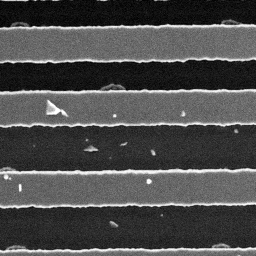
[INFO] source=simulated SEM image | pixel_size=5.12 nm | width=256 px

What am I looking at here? lines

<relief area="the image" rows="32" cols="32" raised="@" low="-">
--------------------------------
--------------------------------
--------------------------------
@@@@@@@@@@@@@@@@@@@@@@@@@@@@@@@@
@@@@@@@@@@@@@@@@@@@@@@@@@@@@@@@@
@@@@@@@@@@@@@@@@@@@@@@@@@@@@@@@@
@@@@@@@@@@@@@@@@@@@@@@@@@@@@@@@@
@@@@@@@@@@@@@@@@@@@@@@@-----@@@-
--------------------------------
--------------------------------
--------------------------------
@@@@@@@@@@@@@@@@@@@@@@@@@@@@@@@@
@@@@@@@@@@@@@@@@@@@@@@@@@@@@@@@@
@@@@@@@@@@@@@@@@@@@@@@@@@@@@@@@@
@@@@@@@@@@@@@@@@@@@@@@@@@@@@@@@@
@@@@@@@@@@@@@@@@@@@@@@@@@@@@@@@@
--------------------------------
--------------------------------
--------------------------------
--------------------------------
--------------------------------
@@@@@@@@@@@@@@@@@@@@@@@@@@@@@@@@
@@@@@@@@@@@@@@@@@@@@@@@@@@@@@@@@
@@@@@@@@@@@@@@@@@@@@@@@@@@@@@@@@
@@@@@@@@@@@@@@@@@@@@@@@@@@@@@@@@
@@@@@@@@@@@@@@@@@@@@@@@@@@@@@@@@
--------------------------------
--------------------------------
--------------------------------
--------------------------------
--------------------------------
@@@@@@@@@@@@@@@@@@@@@@@@@@@@@@@@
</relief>